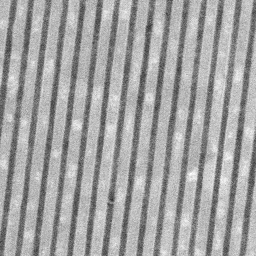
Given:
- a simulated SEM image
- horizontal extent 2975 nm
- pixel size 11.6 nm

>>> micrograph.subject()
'parallel lines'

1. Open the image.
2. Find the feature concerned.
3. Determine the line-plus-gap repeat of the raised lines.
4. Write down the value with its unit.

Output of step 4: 199 nm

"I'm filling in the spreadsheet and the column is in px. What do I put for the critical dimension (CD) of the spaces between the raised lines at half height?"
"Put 6.94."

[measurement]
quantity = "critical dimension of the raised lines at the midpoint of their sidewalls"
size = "114 nm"